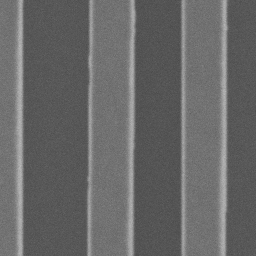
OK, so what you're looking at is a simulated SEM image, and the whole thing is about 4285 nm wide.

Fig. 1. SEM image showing lines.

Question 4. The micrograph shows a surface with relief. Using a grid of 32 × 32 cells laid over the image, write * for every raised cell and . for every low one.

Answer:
***........******......*****....
***........******......*****....
***........******......*****....
***........******......*****....
***........******......*****....
***........******......*****....
***........******......*****....
***........******......*****....
***........******......*****....
***........******......*****....
***........******......*****....
***........******......*****....
***........******......*****....
***........******......*****....
***........******......*****....
***........******......*****....
***........******......*****....
***........******......*****....
***........******......*****....
***........******......*****....
***........******......*****....
***........******......*****....
***........******......*****....
***........******......*****....
***........******......*****....
***........******......*****....
***........******......*****....
***........******......*****....
***........******......*****....
***........******......*****....
***........******......*****....
***........******......*****....